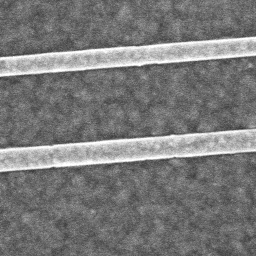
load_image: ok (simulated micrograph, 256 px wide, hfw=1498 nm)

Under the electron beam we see one or a few lines or trenches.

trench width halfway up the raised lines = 432 nm